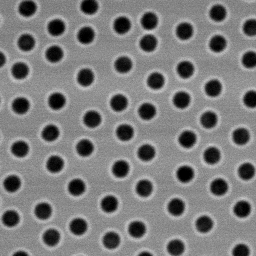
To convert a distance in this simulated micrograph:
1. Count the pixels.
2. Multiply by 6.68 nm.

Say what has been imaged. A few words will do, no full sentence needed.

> a regular array of holes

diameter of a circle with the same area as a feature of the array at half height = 126 nm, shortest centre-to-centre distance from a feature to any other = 30.7 px